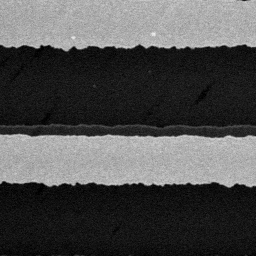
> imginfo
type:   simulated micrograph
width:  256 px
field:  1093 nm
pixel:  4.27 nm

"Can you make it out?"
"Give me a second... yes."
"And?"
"lines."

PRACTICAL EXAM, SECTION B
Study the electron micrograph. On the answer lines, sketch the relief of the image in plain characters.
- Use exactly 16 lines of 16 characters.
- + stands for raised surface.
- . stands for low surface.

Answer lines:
++++++++++++++++
++++++++++++++++
++++++++++++++++
................
................
................
................
................
++..............
++++++++++++++++
++++++++++++++++
...+..++.++.+.++
................
................
................
................